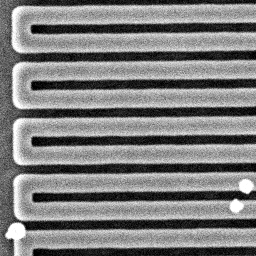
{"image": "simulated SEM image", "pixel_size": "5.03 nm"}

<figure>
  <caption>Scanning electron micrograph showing groups of lines, slits or small figures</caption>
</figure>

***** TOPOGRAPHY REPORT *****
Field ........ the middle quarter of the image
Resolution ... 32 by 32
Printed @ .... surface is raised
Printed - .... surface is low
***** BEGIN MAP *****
@@@@@@@@@@@@@@@@@@@@@@@@@@@@@@@@
@@@@@@@@@@@@@@@@@@@@@@@@@@@@@@@@
@@@@@@@@@@@@@@@@@@@@@@@@@@@@@@@@
@@@@@@@@@@@@@@@@@@@@@@@@@@@@@@@@
--------------------------------
--------------------------------
----------------------@@--@@@--@
@@@@@@@@@@@@@@@@@@@@@@@@@@@@@@@@
@@@@@@@@@@@@@@@@@@@@@@@@@@@@@@@@
@@@@@@@@@@@@@@@@@@@@@@@@@@@@@@@@
@@@@@@@@@@@@@@@@@@@@@@@@@@@@@@@@
--------------------------------
--------------------------------
---------@@@@@@@@@@@@@@@@@@@@@@@
@@@@@@@@@@@@@@@@@@@@@@@@@@@@@@@@
@@@@@@@@@@@@@@@@@@@@@@@@@@@@@@@@
@@@@@@@@@@@@@@@@@@@@@@@@@@@@@@@@
@@@@@@@@@@@@@@@@@@@@@@@@@@@@@@@@
--------------------------------
--------------------------------
-------------@@@@@@@@@@@@@@@@@@@
@@@@@@@@@@@@@@@@@@@@@@@@@@@@@@@@
@@@@@@@@@@@@@@@@@@@@@@@@@@@@@@@@
@@@@@@@@@@@@@@@@@@@@@@@@@@@@@@@@
@@@@@@@@@@@@@@@@@@@@@@@@@@@@@@@@
--------------------------------
--------------------------------
--------------------@@@@@@@@@@@@
@@@@@@@@@@@@@@@@@@@@@@@@@@@@@@@@
@@@@@@@@@@@@@@@@@@@@@@@@@@@@@@@@
@@@@@@@@@@@@@@@@@@@@@@@@@@@@@@@@
@@@@@@@@@@@@@@@@@@@@@@@@@@@@@@@@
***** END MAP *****